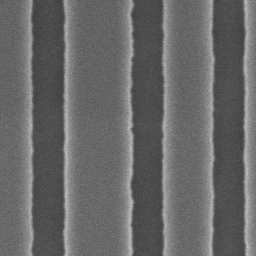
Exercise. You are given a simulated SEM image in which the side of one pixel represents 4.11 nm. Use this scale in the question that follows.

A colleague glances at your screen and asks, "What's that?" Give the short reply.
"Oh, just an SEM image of lines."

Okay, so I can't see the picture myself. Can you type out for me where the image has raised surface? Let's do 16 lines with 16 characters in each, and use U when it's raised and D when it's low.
UUDDUUUUDDUUUDDU
UUDDUUUUDDUUUDDU
UUDDUUUUDDUUUDDU
UUDDUUUUDDUUUDDU
UUDDUUUUDDUUUDDU
UUDDUUUUDDUUUDDU
UUDDUUUUDDUUUDDU
UUDDUUUUDDUUUDDU
UUDDUUUUDDUUUDDU
UUDDUUUUDDUUUDDU
UUDDUUUUDDUUUDDU
UUDDUUUUDDUUUDDU
UUDDUUUUDDUUUDDU
UUDDUUUUDDUUUDDU
UUDDUUUUDDUUUDDU
UUDDUUUUDDUUUDDU